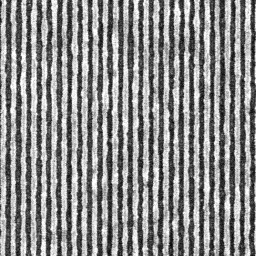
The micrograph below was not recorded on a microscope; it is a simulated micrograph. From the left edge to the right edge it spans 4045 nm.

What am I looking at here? parallel lines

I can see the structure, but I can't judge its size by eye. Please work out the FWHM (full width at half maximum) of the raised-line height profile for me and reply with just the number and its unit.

61.2 nm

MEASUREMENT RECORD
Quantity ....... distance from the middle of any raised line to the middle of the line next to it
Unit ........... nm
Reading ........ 161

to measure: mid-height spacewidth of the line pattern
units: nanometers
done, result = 92.8